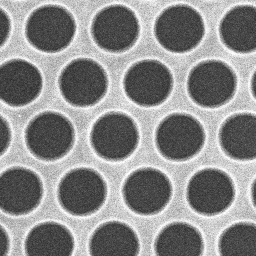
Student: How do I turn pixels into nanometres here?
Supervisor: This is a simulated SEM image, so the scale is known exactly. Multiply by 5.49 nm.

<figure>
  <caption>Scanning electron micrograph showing a regular array of holes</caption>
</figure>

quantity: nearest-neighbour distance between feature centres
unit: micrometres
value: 0.345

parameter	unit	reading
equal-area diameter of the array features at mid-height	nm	261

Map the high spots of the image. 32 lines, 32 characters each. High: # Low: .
################################
####....####.....###.....####...
.###.....###.....###.....###....
.##......###.....##.......#.....
.##......###.....##......###....
####.....###.....###.....###....
##############.#######.#######.#
##.######..#####################
.....###.....###.....###.....###
.....###.....###.....###.....###
.....##......##.......#......##.
.....###.....###.....###.....###
....####....####.....###.....###
################################
#####...#####...#####...#####...
.###.....###.....###.....###....
.##......##......###.....###....
.##......##......###......##....
.###.....###.....###.....###....
#####...#####...#####...#####...
################################
#...#####...#####...#####...####
.....###.....###.....###.....###
.....##......##......##......##.
.....##......###.....##......###
.....###.....###.....###.....###
#...#####...#####...#####...####
################################
####....####....#####...#####...
.##......###.....###.....###....
.##......##......##......##.....
.##......##......##......##.....